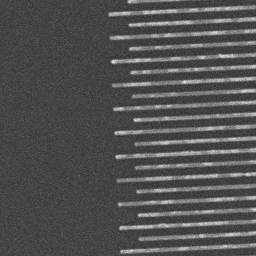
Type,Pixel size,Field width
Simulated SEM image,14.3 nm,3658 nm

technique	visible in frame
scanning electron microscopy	parallel lines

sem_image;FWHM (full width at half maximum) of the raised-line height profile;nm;41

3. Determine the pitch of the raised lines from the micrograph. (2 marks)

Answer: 170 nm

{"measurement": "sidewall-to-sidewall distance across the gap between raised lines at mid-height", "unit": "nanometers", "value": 130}